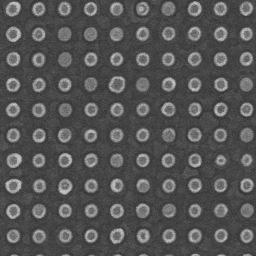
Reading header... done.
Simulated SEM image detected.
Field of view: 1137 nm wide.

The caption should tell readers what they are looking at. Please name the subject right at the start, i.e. a regular array of raised bodies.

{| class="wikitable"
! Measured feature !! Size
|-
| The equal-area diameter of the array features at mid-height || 60.1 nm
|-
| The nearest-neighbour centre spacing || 111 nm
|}